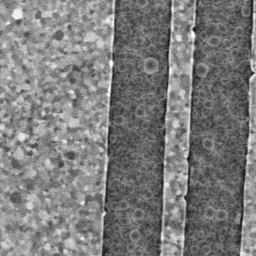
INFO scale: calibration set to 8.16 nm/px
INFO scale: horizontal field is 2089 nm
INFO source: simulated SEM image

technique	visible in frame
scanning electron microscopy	one or a few lines or trenches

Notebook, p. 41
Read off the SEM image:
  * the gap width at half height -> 0.471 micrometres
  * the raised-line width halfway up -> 187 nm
